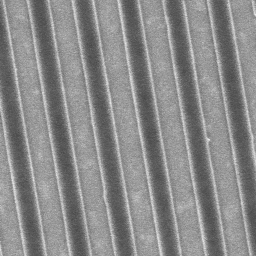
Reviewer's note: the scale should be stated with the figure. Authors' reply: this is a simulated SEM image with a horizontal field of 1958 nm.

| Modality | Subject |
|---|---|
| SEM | parallel lines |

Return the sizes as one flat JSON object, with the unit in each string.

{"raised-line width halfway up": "166 nm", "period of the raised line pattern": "340 nanometers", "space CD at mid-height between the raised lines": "174 nanometers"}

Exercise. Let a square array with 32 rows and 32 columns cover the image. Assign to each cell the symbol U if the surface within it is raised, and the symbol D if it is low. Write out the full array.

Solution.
UDDUUUDDDUUUDDDUUDDDUUUDDDUUUDDD
UDDDUUDDDUUUDDDUUUDDUUUDDDUUUDDD
UDDDUUUDDUUUDDDUUUDDDUUDDDUUUDDD
UDDDUUUDDDUUDDDUUUDDDUUUDDDUUDDD
UDDDUUUDDDUUDDDUUUDDDUUUDDDUUDDD
UDDDUUUDDDUUUDDDUUDDDUUUDDDUUUDD
UUDDUUUDDDUUUDDDUUDDDUUUDDDUUUDD
UUDDDUUDDDUUUDDDUUUDDDUUDDDUUUDD
UUDDDUUUDDUUUDDDUUUDDDUUDDDUUUDD
UUDDDUUUDDDUUDDDUUUDDDUUUDDDUUDD
UUDDDUUUDDDUUDDDUUUDDDUUUDDDUUDD
UUDDDUUUDDDUUUDDDUUDDDUUUDDDUUUD
UUUDDUUUDDDUUUDDDUUDDDUUUDDDUUUD
UUUDDDUUDDDUUUDDDUUUDDDUUDDDUUUD
UUUDDDUUUDDUUUDDDUUUDDDUUDDDUUUD
UUUDDDUUUDDDUUDDDUUUDDDUUUDDUUUD
DUUDDDUUUDDDUUDDDUUUDDDUUUDDDUUD
DUUDDDUUUDDDUUUDDDUUDDDUUUDDDUUU
DUUUDDUUUDDDUUUDDDUUDDDUUUDDDUUU
DUUUDDDUUDDDUUUDDDUUUDDDUUDDDUUU
DUUUDDDUUUDDUUUDDDUUUDDDUUDDDUUU
DUUUDDDUUUDDDUUDDDUUUDDDUUUDDDUU
DDUUDDDUUUDDDUUDDDUUUDDDUUUDDDUU
DDUUDDDUUUDDDUUUDDDUUDDDUUUDDDUU
DDUUUDDUUUDDDUUUDDDUUDDDUUUDDDUU
DDUUUDDDUUDDDUUUDDDUUUDDDUUDDDUU
DDUUUDDDUUUDDUUUDDDUUUDDDUUUDDUU
DDUUUDDDUUUDDDUUDDDUUUDDDUUUDDUU
DDDUUDDDUUUDDDUUDDDUUUDDDUUUDDDU
DDDUUDDDUUUDDDUUUDDDUUDDDUUUDDDU
DDDUUUDDUUUDDDUUUDDDUUDDDUUUDDDU
DDDUUUDDDUUDDDUUUDDDUUUDDDUUDDDU